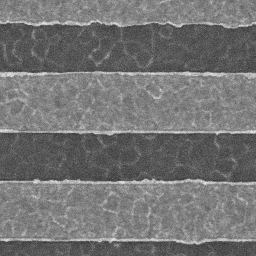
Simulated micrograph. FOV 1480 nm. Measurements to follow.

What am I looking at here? one or a few lines or trenches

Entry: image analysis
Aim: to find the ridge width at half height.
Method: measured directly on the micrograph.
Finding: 59.4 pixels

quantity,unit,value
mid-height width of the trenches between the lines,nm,282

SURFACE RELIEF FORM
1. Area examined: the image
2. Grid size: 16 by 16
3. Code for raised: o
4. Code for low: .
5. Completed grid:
oooooooooooooooo
..o....oo.oo.ooo
................
................
................
oooooooooooooooo
oooooooooooooooo
oooooooooooooooo
................
................
................
oooooooooooooooo
oooooooooooooooo
oooooooooooooooo
oooooooooooooooo
................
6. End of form